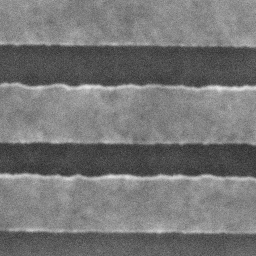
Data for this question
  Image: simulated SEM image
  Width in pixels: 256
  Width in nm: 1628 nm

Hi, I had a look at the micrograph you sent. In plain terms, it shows lines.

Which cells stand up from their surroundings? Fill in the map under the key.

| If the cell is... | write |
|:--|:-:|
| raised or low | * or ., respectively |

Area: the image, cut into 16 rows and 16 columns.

****************
****************
****************
................
................
************.***
****************
****************
****************
................
................
****************
****************
****************
.........*.*****
................